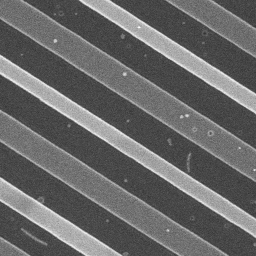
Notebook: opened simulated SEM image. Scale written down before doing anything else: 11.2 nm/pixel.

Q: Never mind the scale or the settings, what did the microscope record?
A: lines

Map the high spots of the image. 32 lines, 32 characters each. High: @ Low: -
@@@@-------@@@@------@@@@@@-----
@@@@@-------@@@@-------@@@@@@---
@@@@@@@-------@@@@-------@@@@@--
--@@@@@@-------@@@@-------@@@@@@
---@@@@@@@-------@@@@-------@@@@
-----@@@@@@-------@@@@-------@@@
-------@@@@@@-------@@@@-------@
@-------@@@@@@@------@@@@-------
@@--------@@@@@@-------@@@@-----
@@@@-------@@@@@@@-------@@@----
--@@@@-------@@@@@@-------@@@@--
---@@@@-------@@@@@@@-------@@@@
-----@@@@-------@@@@@@-------@@@
-------@@@@-------@@@@@@-------@
@-------@@@@-------@@@@@@@------
@@@-------@@@@-------@@@@@@-----
@@@@-------@@@@-------@@@@@@@---
@@@@@@-------@@@@-------@@@@@@--
-@@@@@@--------@@@-------@@@@@@@
---@@@@@@-------@@@@-------@@@@@
----@@@@@@@-------@@@-------@@@@
------@@@@@@-------@@@@-------@@
--------@@@@@@-------@@@--------
@@-------@@@@@@-------@@@@------
@@@@-------@@@@@@-------@@@@----
@@@@@-------@@@@@@-------@@@@---
--@@@@@-------@@@@@@-------@@@@-
----@@@@-------@@@@@@-------@@@@
-----@@@@@-------@@@@@@-------@@
-------@@@@@-------@@@@@@-------
@-------@@@@@-------@@@@@@------
@@@-------@@@@@-------@@@@@@----